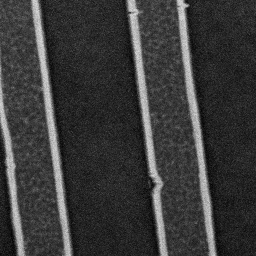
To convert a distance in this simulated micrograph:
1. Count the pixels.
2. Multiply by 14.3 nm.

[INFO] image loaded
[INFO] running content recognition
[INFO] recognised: one or a few lines or trenches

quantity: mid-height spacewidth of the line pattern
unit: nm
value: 1360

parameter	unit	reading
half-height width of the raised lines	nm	681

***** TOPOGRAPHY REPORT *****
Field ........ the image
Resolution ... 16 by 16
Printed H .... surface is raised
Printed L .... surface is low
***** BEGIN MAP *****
HHLLLLLLHHHLLLLL
HHLLLLLLHHHLLLLL
HHHLLLLLLHHHLLLL
HHHLLLLLLHHHLLLL
HHHLLLLLLHHHLLLL
HHHLLLLLLHHHLLLL
HHHLLLLLLHHHLLLL
HHHLLLLLLHHHLLLL
HHHLLLLLLHHHLLLL
LHHLLLLLLHHHHLLL
LHHHLLLLLLHHHLLL
LHHHLLLLLLHHHLLL
LHHHLLLLLLHHHLLL
LHHHLLLLLLHHHLLL
LHHHLLLLLLHHHLLL
LHHHLLLLLLHHHLLL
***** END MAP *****